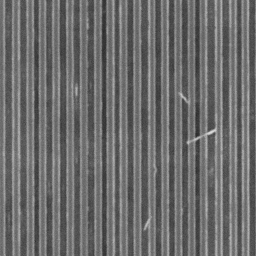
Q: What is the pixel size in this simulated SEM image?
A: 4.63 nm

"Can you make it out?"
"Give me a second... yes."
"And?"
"parallel lines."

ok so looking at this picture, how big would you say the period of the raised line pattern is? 0.0624 microns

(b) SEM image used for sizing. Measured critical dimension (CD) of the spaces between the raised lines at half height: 0.0313 microns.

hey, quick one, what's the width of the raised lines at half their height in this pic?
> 31.3 nm